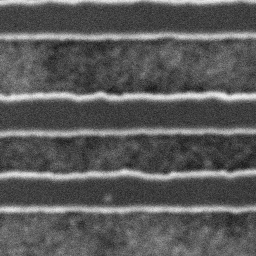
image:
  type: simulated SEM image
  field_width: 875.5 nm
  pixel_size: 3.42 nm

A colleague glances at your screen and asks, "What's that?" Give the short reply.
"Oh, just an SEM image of lines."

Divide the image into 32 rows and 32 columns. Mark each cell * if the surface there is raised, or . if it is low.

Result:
********************************
********************************
********************************
********************************
********************************
................................
................................
................................
................................
................................
................................
................................
********************************
********************************
********************************
********************************
********************************
................................
................................
................................
................................
...............**..........*.***
********************************
********************************
********************************
********************************
................................
................................
................................
................................
................................
................................